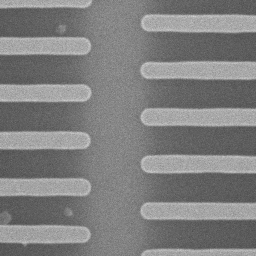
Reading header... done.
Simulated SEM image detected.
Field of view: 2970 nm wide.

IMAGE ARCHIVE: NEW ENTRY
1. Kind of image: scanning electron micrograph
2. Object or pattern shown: groups of lines, slits or small figures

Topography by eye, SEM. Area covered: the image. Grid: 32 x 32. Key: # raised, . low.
###########.....................
................................
..................##############
..................##############
................................
###########.....................
###########.....................
................................
..................##############
..................##############
................................
###########.....................
###########.....................
................................
..................##############
..................##############
................................
###########.....................
##########......................
....................####........
..................##############
..................########.#####
###########.....................
###########.....................
................................
..................##########....
..................##############
................................
###########.....................
###########.....................
................................
..................##############